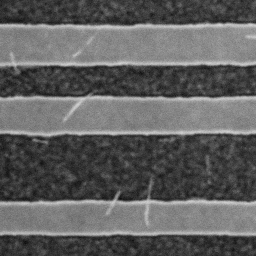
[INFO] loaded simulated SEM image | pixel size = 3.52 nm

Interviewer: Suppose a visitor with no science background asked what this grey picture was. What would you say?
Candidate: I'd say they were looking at lines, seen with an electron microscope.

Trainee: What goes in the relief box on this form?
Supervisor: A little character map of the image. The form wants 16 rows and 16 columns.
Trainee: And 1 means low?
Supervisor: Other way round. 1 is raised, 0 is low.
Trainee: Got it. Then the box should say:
0000000000000100
0000000000000111
1111111111111111
1111111111111111
0000000000000000
0000000000000000
1111111111111111
1111111111111111
0000000000000000
0000000000000000
0000000000000000
0000000000000000
0000000001000000
1111111111111111
1111111111111111
0000000000000000